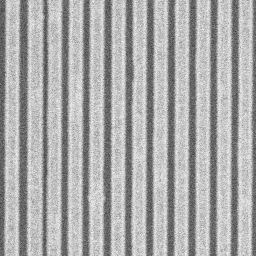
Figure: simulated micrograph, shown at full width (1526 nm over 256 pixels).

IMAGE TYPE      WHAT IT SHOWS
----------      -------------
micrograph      parallel lines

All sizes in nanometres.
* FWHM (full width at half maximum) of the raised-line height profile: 60.3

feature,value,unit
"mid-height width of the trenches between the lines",11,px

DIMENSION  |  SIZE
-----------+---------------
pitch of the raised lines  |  126 nanometers